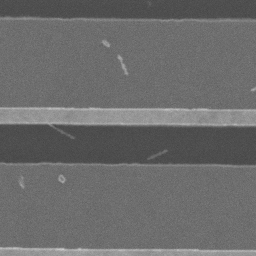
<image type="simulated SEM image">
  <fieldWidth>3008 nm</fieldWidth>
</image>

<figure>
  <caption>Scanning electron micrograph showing lines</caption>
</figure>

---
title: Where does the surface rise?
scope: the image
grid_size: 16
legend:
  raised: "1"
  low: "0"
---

0000000000000000
1111111111111111
1111111111111111
1111111111111111
1111111111111111
1111111111111111
1111111111111111
1111111111111111
0000000000000000
0000000000000000
1111111111111111
1111111111111111
1111111111111111
1111111111111111
1111111111111111
1111111111111111